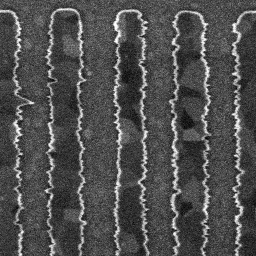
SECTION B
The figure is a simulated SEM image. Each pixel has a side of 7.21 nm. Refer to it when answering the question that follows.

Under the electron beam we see one or a few lines or trenches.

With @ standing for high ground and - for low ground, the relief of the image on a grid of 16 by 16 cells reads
----------------
@--@@--@@--@@--@
@--@@--@@--@@--@
@--@@--@@--@@--@
@--@@--@@--@@--@
@--@@--@@--@@--@
@@-@@--@@--@@--@
@--@@--@@--@@--@
@--@@--@@--@@--@
@--@@--@@--@@--@
@--@@--@@--@@--@
@--@@--@@--@@--@
@--@@--@@--@@--@
@--@@--@@--@@--@
@--@@--@@--@@--@
@--@@--@@--@@--@